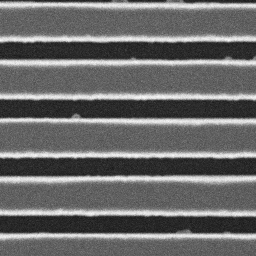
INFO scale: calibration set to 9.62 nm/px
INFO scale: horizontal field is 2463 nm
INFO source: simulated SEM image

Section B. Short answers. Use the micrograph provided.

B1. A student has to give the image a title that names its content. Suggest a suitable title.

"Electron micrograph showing lines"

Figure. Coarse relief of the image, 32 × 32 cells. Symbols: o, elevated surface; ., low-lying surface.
oooooooooooooooooooooooooooooooo
oooooooooooooooooooooooooooooooo
oooooooooooooooooooooooooooooooo
oooooooooooooooooooooooooooooooo
oooooooooooooooooooooooooooooooo
................................
................................
................................
oooooooooooooooooooooooooooooooo
oooooooooooooooooooooooooooooooo
oooooooooooooooooooooooooooooooo
oooooooooooooooooooooooooooooooo
................................
................................
................................
oooooooooooooooooooooooooooooooo
oooooooooooooooooooooooooooooooo
oooooooooooooooooooooooooooooooo
oooooooooooooooooooooooooooooooo
oooooooooooooooooooooooooooooooo
................................
................................
oooooooooooooooooooooooooooooooo
oooooooooooooooooooooooooooooooo
oooooooooooooooooooooooooooooooo
oooooooooooooooooooooooooooooooo
oooooooooooooooooooooooooooooooo
................................
................................
oooooooooooooooooooooooooooooooo
oooooooooooooooooooooooooooooooo
oooooooooooooooooooooooooooooooo